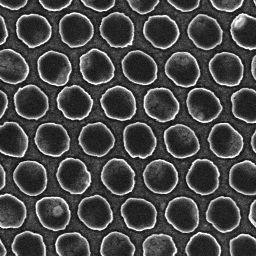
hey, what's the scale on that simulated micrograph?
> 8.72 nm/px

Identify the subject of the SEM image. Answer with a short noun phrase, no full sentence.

a regular array of raised bodies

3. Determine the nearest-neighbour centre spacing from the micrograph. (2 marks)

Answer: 364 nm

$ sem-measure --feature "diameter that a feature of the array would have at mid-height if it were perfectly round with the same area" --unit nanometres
298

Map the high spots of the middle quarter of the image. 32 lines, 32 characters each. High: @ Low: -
@@--@@@@@@@@---@@@@@@@@--@@@@@@@
@@--@@@@@@@@@--@@@@@@@@--@@@@@@@
@----@@@@@@@---@@@@@@@@---@@@@@@
@----@@@@@@@----@@@@@@@---@@@@@@
@-----@@@@-------@@@@@------@@@@
--@---------------------------@-
@@@@@------@@@@@------@@@@------
@@@@@@----@@@@@@@----@@@@@@----@
@@@@@@@--@@@@@@@@@--@@@@@@@@---@
@@@@@@@--@@@@@@@@@--@@@@@@@@---@
@@@@@@@---@@@@@@@@--@@@@@@@@@--@
@@@@@@@---@@@@@@@@--@@@@@@@@@--@
@@@@@@-----@@@@@@@---@@@@@@@----
-@@@@-------@@@@@------@@@@-----
--------------------------------
------@@@@------@@@@@------@@@--
-----@@@@@@----@@@@@@@----@@@@@@
@---@@@@@@@@---@@@@@@@---@@@@@@@
@---@@@@@@@@@--@@@@@@@@--@@@@@@@
@---@@@@@@@@@--@@@@@@@@--@@@@@@@
@---@@@@@@@@---@@@@@@@@---@@@@@@
@----@@@@@@-----@@@@@@----@@@@@@
------@@@@------@@@@@@-----@@@@@
--------------------------------
@@@@@------@@@@-------@@@@------
@@@@@-----@@@@@@-----@@@@@@-----
@@@@@@----@@@@@@@---@@@@@@@@---@
@@@@@@---@@@@@@@@@--@@@@@@@@---@
@@@@@@---@@@@@@@@---@@@@@@@@---@
@@@@@@----@@@@@@@---@@@@@@@@---@
@@@@@@-----@@@@@@----@@@@@@@---@
-@@@@-------@@@@@-----@@@@@-----